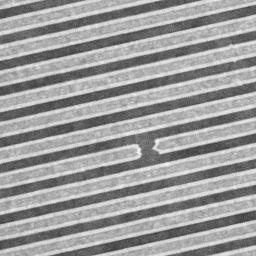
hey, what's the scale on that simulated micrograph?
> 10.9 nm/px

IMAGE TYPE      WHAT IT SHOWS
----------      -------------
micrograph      parallel lines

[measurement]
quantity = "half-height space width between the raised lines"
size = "139 nm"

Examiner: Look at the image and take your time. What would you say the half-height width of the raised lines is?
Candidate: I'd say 130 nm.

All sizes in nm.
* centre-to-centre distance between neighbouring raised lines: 275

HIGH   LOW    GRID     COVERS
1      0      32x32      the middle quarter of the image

11111000000000000000011111111111
10000000000000001111111111111100
00000000000011111111111110000000
00000001111111111111100000000000
00011111111111110000000000000000
11111111111100000000000000001111
11111110000000000000001111111111
11000000000000000011111111111111
00000000000001111111111111110000
00000000011111111111111000000000
00001111111111111100000000000000
11111111111111000000000000000111
11111111100000000000000001111111
11111000000000000000111111111111
00000000000000011111111111111000
00000000000111111111111100000000
00000011111111111111100000000000
00111111111111100000000000000001
11111111111000000000000000011111
11111110000000000000000111111111
11000000000000000000000111111110
00000000000001111110000011100000
00000000011111111110000000000000
00001111111111111000000000000000
11111111111110000000000000001111
11111111000000000000000011111111
11110000000000000001111111111111
00000000000000111111111111111000
00000000001111111111111100000000
00000011111111111111000000000000
01111111111111100000000000000011
11111111111000000000000000111111